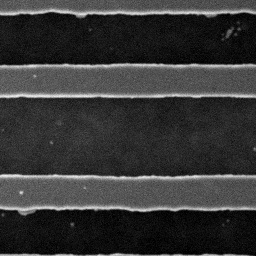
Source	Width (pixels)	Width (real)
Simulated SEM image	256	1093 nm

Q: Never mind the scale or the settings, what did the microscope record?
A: lines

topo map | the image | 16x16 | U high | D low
UUUUUUUUUUUUUUUU
DDDDDDDDDDDDDDDD
DDDDDDDDDDDDDDDD
DDDDDDDDDDDDDDDD
UUUUUUUUUUUUUUUU
UUUUUUUUUUUUUUUU
DDDDDDDDDDDDDDDD
DDDDDDDDDDDDDDDD
DDDDDDDDDDDDDDDD
DDDDDDDDDDDDDDDD
DDDDDDDDDDDDDDDD
UUUUUUUUUUUUUUUU
UUUUUUUUUUUUUUUU
DDDDDDDDDDDDDDDD
DDDDDDDDDDDDDDDD
DDDDDDDDDDDDDDDD